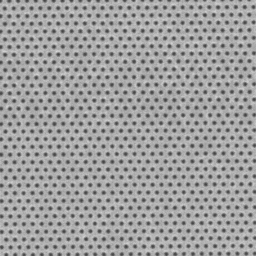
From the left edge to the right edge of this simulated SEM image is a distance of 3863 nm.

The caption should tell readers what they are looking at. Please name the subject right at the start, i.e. a regular array of holes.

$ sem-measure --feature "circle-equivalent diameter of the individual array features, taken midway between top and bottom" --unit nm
74.2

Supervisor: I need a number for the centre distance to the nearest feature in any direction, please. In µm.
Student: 0.129